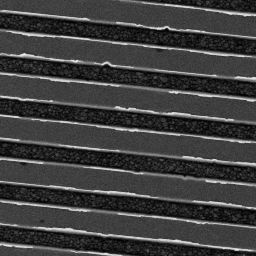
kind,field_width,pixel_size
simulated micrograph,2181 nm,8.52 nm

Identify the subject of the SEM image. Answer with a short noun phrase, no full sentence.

parallel lines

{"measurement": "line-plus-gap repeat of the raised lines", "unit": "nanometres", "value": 361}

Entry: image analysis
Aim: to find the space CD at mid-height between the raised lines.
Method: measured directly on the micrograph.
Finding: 152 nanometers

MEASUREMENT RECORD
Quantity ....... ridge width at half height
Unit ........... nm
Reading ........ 210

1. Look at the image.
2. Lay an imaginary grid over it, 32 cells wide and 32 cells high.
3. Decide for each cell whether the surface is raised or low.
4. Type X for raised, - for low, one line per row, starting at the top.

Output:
XXXXXXXXXXXXXXXXXXXX------------
XXXXXXXXXXXXXXXXXXXXXXXXXXXXX---
----------XXXXXXXXXXXXXXXXXXXXXX
-------------------XXXXXXXXXXXXX
XXXXXXX----------------------XXX
XXXXXXXXXXXXXXXXX---------------
XXXXXXXXXXXXXXXXXXXXXXXXXX------
------XXXXXXXXXXXXXXXXXXXXXXXXXX
----------------XXXXXXXXXXXXXXXX
XXXX----------------------XXXXXX
XXXXXXXXXXXXX-------------------
XXXXXXXXXXXXXXXXXXXXXXX---------
---XXXXXXXXXXXXXXXXXXXXXXXXXXXXX
-------------XXXXXXXXXXXXXXXXXXX
XX--------------------XXXXXXXXXX
XXXXXXXXXXX---------------------
XXXXXXXXXXXXXXXXXXXX------------
-XXXXXXXXXXXXXXXXXXXXXXXXXXXXX--
----------XXXXXXXXXXXXXXXXXXXXXX
--------------------XXXXXXXXXXXX
XXXXXXXX----------------------XX
XXXXXXXXXXXXXXXX----------------
XXXXXXXXXXXXXXXXXXXXXXXXXXX-----
-------XXXXXXXXXXXXXXXXXXXXXXXXX
-----------------XXXXXXXXXXXXXXX
XXXX----------------------XXXXXX
XXXXXXXXXXXXXX------------------
XXXXXXXXXXXXXXXXXXXXXXX---------
---XXXXXXXXXXXXXXXXXXXXXXXXXXXXX
-------------XXXXXXXXXXXXXXXXXXX
X----------------------XXXXXXXXX
XXXXXXXXXXX---------------------